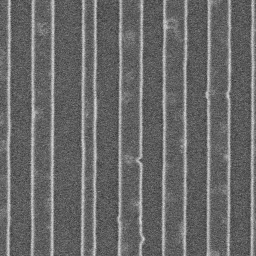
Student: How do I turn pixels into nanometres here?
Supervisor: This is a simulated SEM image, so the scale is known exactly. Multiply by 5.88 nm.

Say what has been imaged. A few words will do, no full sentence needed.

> parallel lines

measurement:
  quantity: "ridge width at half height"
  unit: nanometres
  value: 126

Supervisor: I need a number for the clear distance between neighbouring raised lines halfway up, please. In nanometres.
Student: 132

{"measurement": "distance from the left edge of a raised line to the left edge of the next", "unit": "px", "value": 44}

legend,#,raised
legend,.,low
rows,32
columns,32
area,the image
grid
#...###...##...###..###...###...
#...###...##...###..###...###...
#...###...##...###...##...###...
#...###...##...###...##...###...
#...###...##...###...##...###...
#...###...##...###...##...###...
#...###...##...###...##...###...
#...###...##...###...##...###...
#...###...##...###...##...###...
#...###...##...###...##...###...
#...###...##...###...##...###...
#...###...##...###...##...###...
#...###...##...###...##...###...
#...###...##...###...##...###...
#...###...##...###...##...###...
#...###...##...###...##...###...
#...###...##...###...##...###...
#...###...##...###...##...###...
#...###...##...###...##...###...
#...###...##...###...##...###...
#...###...##...##....##...###...
#...###...##...###...##...###...
#...###...##...###..###...###...
#...###...##...###...##...###...
#...###...##...###..###...###...
#...###...##...###..###...###...
#...###...##...###..###...###...
#...###...##...###..###...###...
#...###...##...###..###...###..#
#...###...##...###..###...###..#
#...###...##...###..###...###..#
#...###...##...###..###...###..#